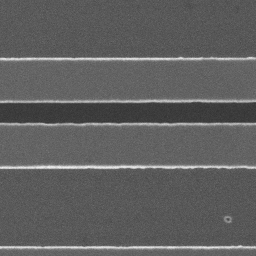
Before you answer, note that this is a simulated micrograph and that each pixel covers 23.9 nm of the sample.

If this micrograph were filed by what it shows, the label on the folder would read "lines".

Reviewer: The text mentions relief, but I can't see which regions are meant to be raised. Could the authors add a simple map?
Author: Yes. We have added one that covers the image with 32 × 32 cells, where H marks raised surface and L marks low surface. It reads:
LLLLLLLLLLLLLLLLLLLLLLLLLLLLLLLL
LLLLLLLLLLLLLLLLLLLLLLLLLLLLLLLL
LLLLLLLLLLLLLLLLLLLLLLLLLLLLLLLL
LLLLLLLLLLLLLLLLLLLLLLLLLLLLLLLL
LLLLLLLLLLLLLLLLLLLLLLLLLLLLLLLL
LLLLLLLLLLLLLLLLLLLLLLLLLLLLLLLL
LLLLLLLLLLLLLLLLLLLLLLLLLLLLLLLL
HHHHHHHHHHHHHHHHHHHHHHHHHHHHHHHH
HHHHHHHHHHHHHHHHHHHHHHHHHHHHHHHH
HHHHHHHHHHHHHHHHHHHHHHHHHHHHHHHH
HHHHHHHHHHHHHHHHHHHHHHHHHHHHHHHH
HHHHHHHHHHHHHHHHHHHHHHHHHHHHHHHH
HHHHHHHHHHHHHHHHHHHHHHHHHHHHHHHH
LLLLLLLLLLLLLLLLLLLLLLLLLLLLLLLL
LLLLLLLLLLLLLLLLLLLLLLLLLLLLLLLL
HHHHHHLLHHHHHHHHHHHHHHHHHHHHHHHH
HHHHHHHHHHHHHHHHHHHHHHHHHHHHHHHH
HHHHHHHHHHHHHHHHHHHHHHHHHHHHHHHH
HHHHHHHHHHHHHHHHHHHHHHHHHHHHHHHH
HHHHHHHHHHHHHHHHHHHHHHHHHHHHHHHH
HHHHHHHHHHHHHHHHHHHHHHHHHHHHHHHH
LLLLLLLLLLLLLLLLLLLLLLLLLLLLLLLL
LLLLLLLLLLLLLLLLLLLLLLLLLLLLLLLL
LLLLLLLLLLLLLLLLLLLLLLLLLLLLLLLL
LLLLLLLLLLLLLLLLLLLLLLLLLLLLLLLL
LLLLLLLLLLLLLLLLLLLLLLLLLLLLLLLL
LLLLLLLLLLLLLLLLLLLLLLLLLLLLLLLL
LLLLLLLLLLLLLLLLLLLLLLLLLLLLLLLL
LLLLLLLLLLLLLLLLLLLLLLLLLLLLLLLL
LLLLLLLLLLLLLLLLLLLLLLLLLLLLLLLL
LLLLLLLLLLLLLLLLLLLLLLLLLLLLLLLL
HHHHHHHHHHHHHHHHHHHHHHHHHHHHHHHH